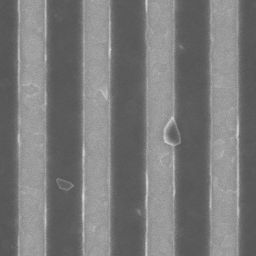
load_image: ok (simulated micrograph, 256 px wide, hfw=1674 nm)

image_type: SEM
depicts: one or a few lines or trenches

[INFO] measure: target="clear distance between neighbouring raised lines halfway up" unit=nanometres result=164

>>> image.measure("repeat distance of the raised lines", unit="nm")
416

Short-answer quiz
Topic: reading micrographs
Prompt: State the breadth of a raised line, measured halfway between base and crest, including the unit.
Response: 0.252 µm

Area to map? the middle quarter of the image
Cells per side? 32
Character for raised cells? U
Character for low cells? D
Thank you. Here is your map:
UUUUUDDDDDDUUUUUUUUUUDDDDDDUUUUU
UUUUUDDDDDDUUUUUUUUUUDDDDDDUUUUU
UUUUUDDDDDDUUUUUUUUUUDDDDDDUUUUU
UUUUUDDDDDDUUUUUUUUUUDDDDDDUUUUU
UUUUUDDDDDDUUUUUUUUUUDDDDDDUUUUU
UUUUUDDDDDDUUUUUUUUUUDDDDDDUUUUU
UUUUUDDDDDUUUUUUUUUUUDDDDDDUUUUU
UUUUUDDDDDUUUUUUUUUUUDDDDDDUUUUU
UUUUUDDDDDDUUUUUUUUUUDDDDDDUUUUU
UUUUUDDDDDDUUUUUUUUUUDDDDDDUUUUU
UUUUUDDDDDDUUUUUUUUUUDDDDDDUUUUU
UUUUUDDDDDDUUUUUUUUUUDDDDDDUUUUU
UUUUUDDDDDDUUUUUUUUUUDDDDDDUUUUU
UUUUUDDDDDDUUUUUUUUUUDDDDDDUUUUU
UUUUUDDDDDDUUUUUUUUUUDDDDDUUUUUU
UUUUUDDDDDDUUUUUUUUUUDDDDDUUUUUU
UUUUUDDDDDDUUUUUUUUUUDDDDUUUUUUU
UUUUUDDDDDDUUUUUUUUUUDDDDUUUUUUU
UUUUUDDDDDDUUUUUUUUUUDDDDUUUUUUU
UUUUUDDDDDDUUUUUUUUUUDDDDUUUUUUU
UUUUUDDDDDDUUUUUUUUUUDDDDDDUUUUU
UUUUUDDDDDDUUUUUUUUUUDDDDDDUUUUU
UUUUUDDDDDDUUUUUUUUUUDDDDDDUUUUU
UUUUUDDDDDDUUUUUUUUUUDDDDDDUUUUU
UUUUUDDDDDDUUUUUUUUUUDDDDDDUUUUU
UUUUUDDDDDDUUUUUUUUUUDDDDDDUUUUU
UUUUUDDDDDDUUUUUUUUUUDDDDDDUUUUU
UUUUUDDDDDDUUUUUUUUUUDDDDDDUUUUU
UUUUUDDDDDDUUUUUUUUUUDDDDDDUUUUU
UUUUUDDDDDDUUUUUUUUUUDDDDDDUUUUU
UUUUUDDDDDDUUUUUUUUUUDDDDDDUUUUU
UUUUUDDDDDDUUUUUUUUUUDDDDDDUUUUU